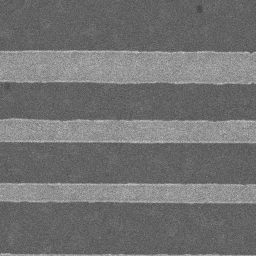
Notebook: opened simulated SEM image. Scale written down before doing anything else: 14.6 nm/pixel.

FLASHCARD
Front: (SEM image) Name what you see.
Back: one or a few lines or trenches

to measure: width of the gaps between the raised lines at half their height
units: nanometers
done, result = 630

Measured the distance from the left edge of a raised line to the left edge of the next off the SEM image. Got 0.919 microns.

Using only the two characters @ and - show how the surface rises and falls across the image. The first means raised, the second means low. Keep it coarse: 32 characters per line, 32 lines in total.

--------------------------------
--------------------------------
--------------------------------
--------------------------------
--------------------------------
--------------------------------
@@@@@@@@@@@-@@@----------@@-----
@@@@@@@@@@@@@@@@@@@@@@@@@@@@@@@@
@@@@@@@@@@@@@@@@@@@@@@@@@@@@@@@@
@@@@@@@@@@@@@@@@@@@@@@@@@@@@@@@@
---------------------------@----
--------------------------------
--------------------------------
--------------------------------
--------------------------------
@@@@@@@@@@@@@@@@@@@@@@@@@@@@@@@@
@@@@@@@@@@@@@@@@@@@@@@@@@@@@@@@@
@@@@@@@@@@@@@@@@@@@@@@@@@@@@@@@@
--------------------------------
--------------------------------
--------------------------------
--------------------------------
--------------------------------
@@@@@@@@@@@@@@@@@@@@@@@@@@@@@@@@
@@@@@@@@@@@@@@@@@@@@@@@@@@@@@@@@
--------------------------------
--------------------------------
--------------------------------
--------------------------------
--------------------------------
--------------------------------
--------------------------------